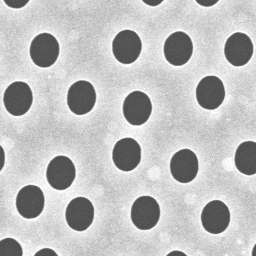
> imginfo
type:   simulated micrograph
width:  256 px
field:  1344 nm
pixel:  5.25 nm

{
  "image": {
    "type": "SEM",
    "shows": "a regular array of holes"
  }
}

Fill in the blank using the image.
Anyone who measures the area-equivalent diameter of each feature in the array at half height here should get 168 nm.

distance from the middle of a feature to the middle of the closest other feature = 0.271 µm